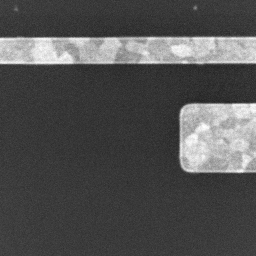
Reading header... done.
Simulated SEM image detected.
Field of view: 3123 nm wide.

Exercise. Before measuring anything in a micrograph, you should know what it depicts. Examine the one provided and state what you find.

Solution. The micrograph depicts wiring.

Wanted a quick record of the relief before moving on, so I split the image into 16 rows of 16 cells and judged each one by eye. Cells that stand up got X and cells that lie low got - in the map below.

----------------
----------------
XXXXXXXXXXXXXXXX
XXXXXXXXXXXXXXXX
----------------
----------------
----------------
-----------XXXXX
-----------XXXXX
-----------XXXXX
------------XXXX
----------------
----------------
----------------
----------------
----------------